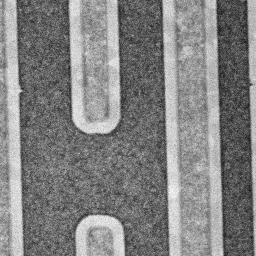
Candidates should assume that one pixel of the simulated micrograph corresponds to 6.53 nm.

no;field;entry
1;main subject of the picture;one or a few lines or trenches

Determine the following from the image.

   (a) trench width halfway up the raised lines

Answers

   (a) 364 nanometers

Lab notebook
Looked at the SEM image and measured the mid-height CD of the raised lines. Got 280 nm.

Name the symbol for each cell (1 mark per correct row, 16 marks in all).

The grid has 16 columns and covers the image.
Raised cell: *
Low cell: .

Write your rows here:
*....**...***...
*....**....**...
*....**....**...
*....**....**...
*....**....**...
*....**....**...
*....**....**...
*....**....**...
*..........**...
*..........**...
*..........**...
*..........**...
*..........***..
*..........***..
*....**....***..
*....**....***..